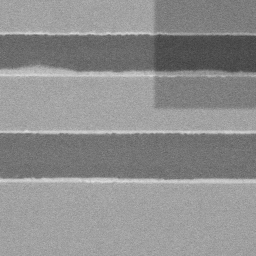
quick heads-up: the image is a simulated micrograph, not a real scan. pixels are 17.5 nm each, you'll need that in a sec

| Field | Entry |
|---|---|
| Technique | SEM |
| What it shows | lines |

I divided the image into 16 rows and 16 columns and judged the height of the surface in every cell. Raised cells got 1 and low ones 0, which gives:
1111111111111111
1111111111111111
0000000000000000
0000000000000000
0000000000000000
1111111111111111
1111111111111111
1111111111111111
0000000000000000
0000000000000000
0000000000000000
1111111111111111
1111111111111111
1111111111111111
1111111111111111
1111111111111111